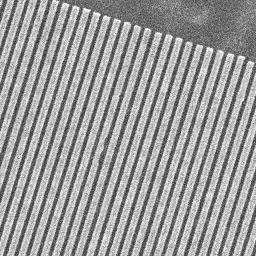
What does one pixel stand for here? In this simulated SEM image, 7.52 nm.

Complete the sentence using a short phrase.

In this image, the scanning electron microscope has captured parallel lines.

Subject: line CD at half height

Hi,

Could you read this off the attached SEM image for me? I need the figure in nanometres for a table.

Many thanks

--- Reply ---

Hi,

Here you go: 43.9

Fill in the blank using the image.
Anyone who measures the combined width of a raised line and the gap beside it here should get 80.9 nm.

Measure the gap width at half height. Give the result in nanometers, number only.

36.8